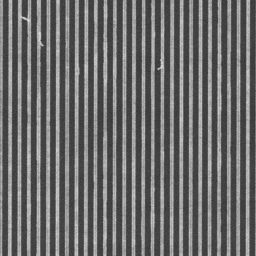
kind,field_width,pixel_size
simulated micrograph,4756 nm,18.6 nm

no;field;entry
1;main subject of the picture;parallel lines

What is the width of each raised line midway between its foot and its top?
39.5 nm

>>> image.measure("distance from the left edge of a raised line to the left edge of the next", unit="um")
0.177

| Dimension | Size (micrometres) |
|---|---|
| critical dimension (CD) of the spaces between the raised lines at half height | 0.135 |